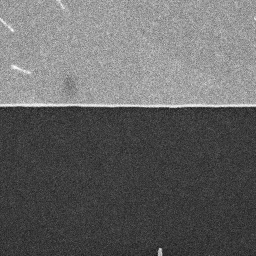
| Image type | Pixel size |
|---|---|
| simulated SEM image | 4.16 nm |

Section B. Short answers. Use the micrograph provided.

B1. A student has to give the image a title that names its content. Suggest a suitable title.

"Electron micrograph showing one or a few lines or trenches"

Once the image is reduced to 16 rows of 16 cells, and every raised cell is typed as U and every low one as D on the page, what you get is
UUUUUUUUUUUUUUUU
UUUUUUUUUUUUUUUU
UUUUUUUUUUUUUUUU
UUUUUUUUUUUUUUUU
UUUUUUUUUUUUUUUU
UUUUUUUUUUUUUUUU
UUUUUUUUUUUUUUUU
DDDDDDDDDDDDDDDD
DDDDDDDDDDDDDDDD
DDDDDDDDDDDDDDDD
DDDDDDDDDDDDDDDD
DDDDDDDDDDDDDDDD
DDDDDDDDDDDDDDDD
DDDDDDDDDDDDDDDD
DDDDDDDDDDDDDDDD
DDDDDDDDDDDDDDDD